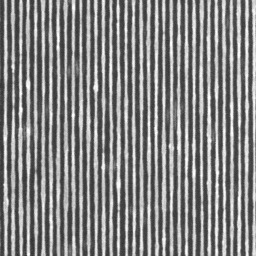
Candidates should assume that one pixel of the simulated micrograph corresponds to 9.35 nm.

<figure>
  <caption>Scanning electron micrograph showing parallel lines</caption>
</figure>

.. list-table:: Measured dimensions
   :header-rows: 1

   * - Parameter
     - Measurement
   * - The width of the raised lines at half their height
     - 22.2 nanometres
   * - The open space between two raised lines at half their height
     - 50.3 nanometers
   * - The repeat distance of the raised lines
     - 70.5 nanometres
